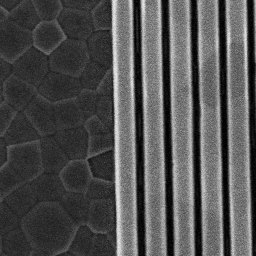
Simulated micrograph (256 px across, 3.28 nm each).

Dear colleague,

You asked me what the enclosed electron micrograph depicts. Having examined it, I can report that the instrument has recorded parallel lines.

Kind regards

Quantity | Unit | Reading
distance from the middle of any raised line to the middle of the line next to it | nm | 93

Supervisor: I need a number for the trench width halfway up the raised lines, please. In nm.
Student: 25.8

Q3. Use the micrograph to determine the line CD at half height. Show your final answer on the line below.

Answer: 65.4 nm